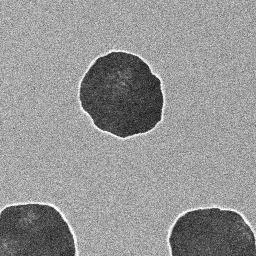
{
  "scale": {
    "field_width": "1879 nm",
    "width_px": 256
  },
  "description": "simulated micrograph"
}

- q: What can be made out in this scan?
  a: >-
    holes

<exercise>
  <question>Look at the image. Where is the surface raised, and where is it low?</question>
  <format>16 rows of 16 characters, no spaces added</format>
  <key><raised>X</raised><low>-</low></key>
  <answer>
XXXXXXXXXXXXXXXX
XXXXXXXXXXXXXXXX
XXXXXXXXXXXXXXXX
XXXXXX--XXXXXXXX
XXXXX-----XXXXXX
XXXXX-----XXXXXX
XXXXX-----XXXXXX
XXXXXX----XXXXXX
XXXXXXX-XXXXXXXX
XXXXXXXXXXXXXXXX
XXXXXXXXXXXXXXXX
XXXXXXXXXXXXXXXX
XXXXXXXXXXXXXXXX
----XXXXXXX----X
----XXXXXXX-----
-----XXXXXX-----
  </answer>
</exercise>